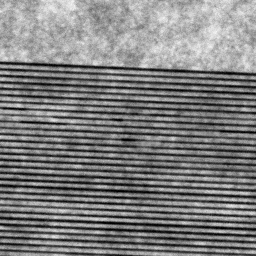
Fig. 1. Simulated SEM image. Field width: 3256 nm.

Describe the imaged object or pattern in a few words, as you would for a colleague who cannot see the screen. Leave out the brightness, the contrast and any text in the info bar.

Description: parallel lines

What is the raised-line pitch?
0.0821 um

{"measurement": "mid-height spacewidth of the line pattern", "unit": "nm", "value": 35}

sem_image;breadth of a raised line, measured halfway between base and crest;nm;46.1